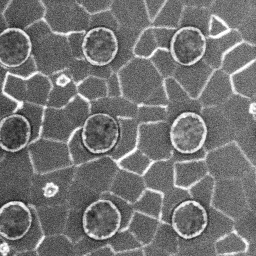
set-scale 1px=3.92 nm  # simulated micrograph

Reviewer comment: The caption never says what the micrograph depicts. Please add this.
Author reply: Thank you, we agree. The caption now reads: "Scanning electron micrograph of raised bodies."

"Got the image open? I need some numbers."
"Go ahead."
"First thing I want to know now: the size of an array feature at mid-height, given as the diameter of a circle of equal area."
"146 nm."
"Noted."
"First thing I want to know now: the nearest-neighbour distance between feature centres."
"340 nanometres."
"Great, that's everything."